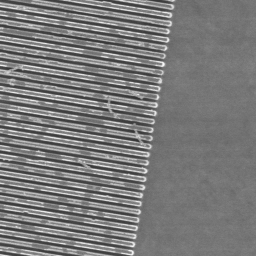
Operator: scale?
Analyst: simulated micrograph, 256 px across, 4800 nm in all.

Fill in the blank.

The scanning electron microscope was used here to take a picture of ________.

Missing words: parallel lines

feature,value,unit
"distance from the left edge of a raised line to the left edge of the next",156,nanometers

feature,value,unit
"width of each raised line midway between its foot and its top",90.3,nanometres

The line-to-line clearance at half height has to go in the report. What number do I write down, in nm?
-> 71.8